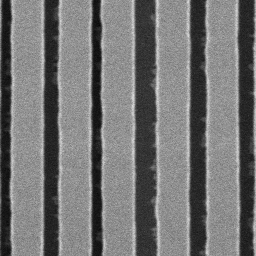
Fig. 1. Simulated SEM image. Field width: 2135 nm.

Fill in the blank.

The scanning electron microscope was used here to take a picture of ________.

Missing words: lines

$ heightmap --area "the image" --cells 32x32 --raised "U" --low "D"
DUUUUDDUUUUDDUUUUDDUUUUUDDUUUUDD
DUUUUDDUUUUDDUUUUDDUUUUUDDUUUUDD
DUUUUDDUUUUDDUUUUDDUUUUUDDUUUUDD
DUUUUDDUUUUDDUUUUDDUUUUUDDUUUUDD
DUUUUDDUUUUDDUUUUDDUUUUUDDUUUUDD
DUUUUDDUUUUDDUUUUDDDUUUUDDUUUUDD
DUUUUDDUUUUDDUUUUDDUUUUUDDUUUUDD
DUUUUUDUUUUDDUUUUDDUUUUUDDUUUUDD
DUUUUDDUUUUDDUUUUDDDUUUUDDUUUUDD
DUUUUDDUUUUDDUUUUDDUUUUUDDUUUUDD
DUUUUDDUUUUDDUUUUDDDUUUUDDUUUUDD
DUUUUDDUUUUDDUUUUDDUUUUUDDUUUUDD
DUUUUDDUUUUDDUUUUDDUUUUUDDUUUUDD
DUUUUDDUUUUDDUUUUDDDUUUUDDUUUUDD
DUUUUDDUUUUDDUUUUDDDUUUUDDUUUUDD
DUUUUDDUUUUDDUUUUDDUUUUUDDUUUUDD
DUUUUDDUUUUDDUUUUDDUUUUUDDUUUUDD
DUUUUDDUUUUDDUUUUDDUUUUUDDUUUUDD
DUUUUDDUUUUDDUUUUDDDUUUUDDUUUUDD
DUUUUDDUUUUDDUUUUDDDUUUUDDUUUUDD
DUUUUDDUUUUDDUUUUDDDUUUUDDUUUUDD
DUUUUDDUUUUDDUUUUDDDUUUUDDUUUUDD
DUUUUDDUUUUDDUUUUDDDUUUUDDUUUUDD
DUUUUDDUUUUDDUUUUDDDUUUUDDUUUUDD
DUUUUDDUUUUDDUUUUDDDUUUUDDUUUUDD
DUUUUDDUUUUDDUUUUDDUUUUUDDUUUUDD
DUUUUDDUUUUDDUUUUDDUUUUUDDUUUUDD
DUUUUDDUUUUDDUUUUDDDUUUUDDUUUUDD
DUUUUDDUUUUDDUUUUDDDUUUUDDUUUUDD
DUUUUDDUUUUDDUUUUDDDUUUUDDUUUUDD
DUUUUDDUUUUDDUUUUDDDUUUUDDUUUUDD
DUUUUDDUUUUDDUUUUDDDUUUUDDUUUUDD